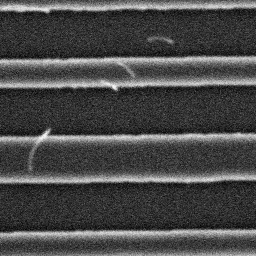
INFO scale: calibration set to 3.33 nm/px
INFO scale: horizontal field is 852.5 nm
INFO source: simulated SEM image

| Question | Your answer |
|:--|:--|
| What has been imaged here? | lines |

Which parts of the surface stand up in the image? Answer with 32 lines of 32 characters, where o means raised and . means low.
oooooooooooooooooooooooooooooooo
................................
................................
................................
................................
................................
................................
.......ooooooooooooooooooooooooo
oooooooooooooooooooooooooooooooo
oooooooooooooooooooooooooooooooo
oooooooooooooooooooooooooooooooo
................................
................................
................................
................................
................................
................................
oooooooooooooooooooooooooooooooo
oooooooooooooooooooooooooooooooo
oooooooooooooooooooooooooooooooo
oooooooooooooooooooooooooooooooo
oooooooooooooooooooooooooooooooo
oooooooooooooooooooooooooooo....
................................
................................
................................
................................
................................
................................
oooooooooooooooooooooooooooooooo
oooooooooooooooooooooooooooooooo
oooooooooooooooooooooooooooooooo